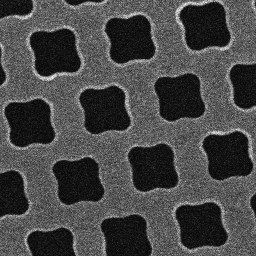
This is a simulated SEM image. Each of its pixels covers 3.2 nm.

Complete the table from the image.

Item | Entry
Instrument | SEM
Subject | a regular array of holes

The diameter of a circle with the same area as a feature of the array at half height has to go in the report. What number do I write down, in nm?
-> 158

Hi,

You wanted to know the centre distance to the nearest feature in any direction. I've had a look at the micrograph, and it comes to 241 nm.